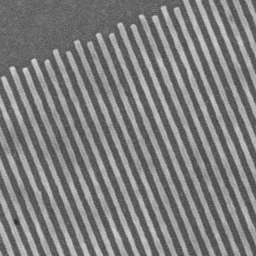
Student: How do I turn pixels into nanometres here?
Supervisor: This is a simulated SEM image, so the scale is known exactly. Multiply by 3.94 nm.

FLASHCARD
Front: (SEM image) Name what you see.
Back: parallel lines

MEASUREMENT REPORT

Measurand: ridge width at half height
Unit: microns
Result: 0.0187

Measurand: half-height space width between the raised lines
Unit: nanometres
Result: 27.9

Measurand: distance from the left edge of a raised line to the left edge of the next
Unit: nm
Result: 45.9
